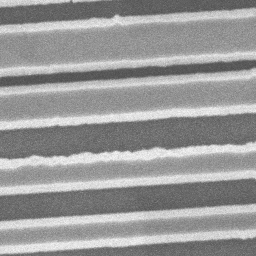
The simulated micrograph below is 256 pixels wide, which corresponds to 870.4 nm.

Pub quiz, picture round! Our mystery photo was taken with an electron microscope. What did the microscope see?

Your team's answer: one or a few lines or trenches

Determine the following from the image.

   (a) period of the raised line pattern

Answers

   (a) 0.211 microns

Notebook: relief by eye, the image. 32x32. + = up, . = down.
................................
................................
................++++++++++++++++
...+++++++++++++++++++++++++++++
++++++++++++++++++++++++++++++++
++++++++++++++++++++++++++++++++
++++++++++++++++++++++++++++++++
++++++++++++++++++++++..........
+++++++++.......................
............................++++
..............++++++++++++++++++
++++++++++++++++++++++++++++++++
++++++++++++++++++++++++++++++++
++++++++++++++++++++++++++++++++
++++++++++++++++++..............
+++.............................
................................
................................
...............................+
..............++++++++++++++++++
++++++++++++++++++++++++++++++++
++++++++++++++++++++++++++++++++
+++++++++++++++++++++...........
++++++..........................
................................
................................
.........................+++++++
..........++++++++++++++++++++++
++++++++++++++++++++++++++++++++
+++++++++++++++++++++++++.......
++++++++++++....................
................................